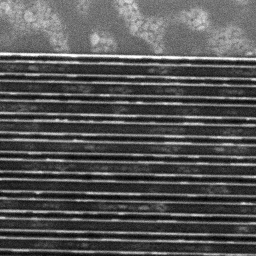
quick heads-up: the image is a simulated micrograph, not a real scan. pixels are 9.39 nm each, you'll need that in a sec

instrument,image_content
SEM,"parallel lines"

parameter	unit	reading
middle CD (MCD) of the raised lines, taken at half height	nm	83.3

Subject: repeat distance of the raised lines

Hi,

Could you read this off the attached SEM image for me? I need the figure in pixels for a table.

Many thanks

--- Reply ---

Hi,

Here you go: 19.6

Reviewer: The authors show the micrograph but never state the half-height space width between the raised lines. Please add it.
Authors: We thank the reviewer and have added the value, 10.9 px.